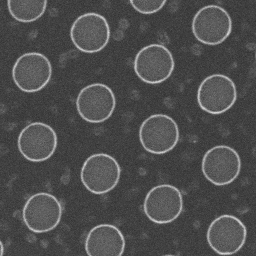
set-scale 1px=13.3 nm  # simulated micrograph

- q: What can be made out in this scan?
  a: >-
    a regular array of holes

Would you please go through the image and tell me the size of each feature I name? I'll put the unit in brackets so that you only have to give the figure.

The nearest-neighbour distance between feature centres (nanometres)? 928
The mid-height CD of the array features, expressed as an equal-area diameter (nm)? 481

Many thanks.